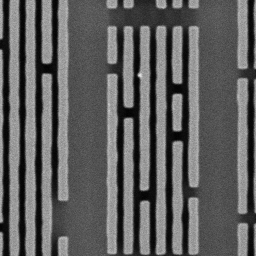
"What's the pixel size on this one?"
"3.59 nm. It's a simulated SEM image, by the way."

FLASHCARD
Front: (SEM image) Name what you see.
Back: groups of lines, slits or small figures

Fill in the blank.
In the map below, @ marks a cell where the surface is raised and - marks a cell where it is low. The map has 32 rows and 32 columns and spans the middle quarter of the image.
@--------------@@--@@--@@--@@--@
@--------------@@--@@--@@--@@--@
@--------------@@--@@--@@--@@--@
@----------@@--@@--@@--@@--@@--@
@----------@@--@@--@@--@@--@@--@
@----------@@--@@--@@--@@------@
@----------@@--@@--@@--@@------@
@----------@@--@@--@@--@@------@
@----------@@--@@--@@--@@--@@--@
@----------@@--@@--@@--@@--@@--@
@----------@@--@@--@@--@@--@@--@
@----------@@------@@--@@--@@--@
@----------@@------@@--@@--@@--@
@----------@@------@@--@@--@@--@
@----------@@--@@--@@--@@--@@--@
@----------@@--@@--@@--@@--@@--@
@----------@@--@@--@@--@@--@@--@
@----------@@--@@--@@--@@------@
@----------@@--@@--@@--@@------@
@----------@@--@@--@@--@@---@--@
@----------@@--@@--@@--@@--@@--@
@----------@@--@@--@@--@@--@@--@
@----------@@--@@--@@--@@--@@--@
@----------@@--@@--@@--@@--@@--@
@----------@@--@@--@@--@@--@@--@
@----------@@--@@--@@--@@--@@--@
@----------@@--@@--@@--@@--@@--@
@----------@@--@@--@@--@@--@@--@
@----------@@--@@--@@--@@--@@--@
@----------@@--@@--@@--@@--@@--@
@----------@@--@@--@@--@@--@@--@
@----------@@--@@--@@--@@--@@---